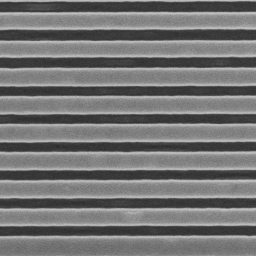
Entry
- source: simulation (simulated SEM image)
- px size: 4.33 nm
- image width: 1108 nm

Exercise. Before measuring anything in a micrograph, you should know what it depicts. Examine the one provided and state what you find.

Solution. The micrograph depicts parallel lines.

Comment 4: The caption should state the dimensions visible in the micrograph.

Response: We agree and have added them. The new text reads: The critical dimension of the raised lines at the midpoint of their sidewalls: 0.0769 micrometres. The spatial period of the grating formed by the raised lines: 122 nm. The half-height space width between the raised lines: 44.4 nm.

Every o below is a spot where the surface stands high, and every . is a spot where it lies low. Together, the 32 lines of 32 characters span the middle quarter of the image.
................................
oooooooooooooooooooooooooooooooo
oooooooooooooooooooooooooooooooo
oooooooooooooooooooooooooooooooo
oooooooooooooooooooooooooooooooo
..oooo.................oo.......
................................
................................
oooooooooooooooooooooooooooooooo
oooooooooooooooooooooooooooooooo
oooooooooooooooooooooooooooooooo
oooooooooooooooooooooooooooooooo
..o.oo.........o...oo...........
................................
................................
oooooooooooooooooooooooooooooooo
oooooooooooooooooooooooooooooooo
oooooooooooooooooooooooooooooooo
oooooooooooooooooooooooooooooooo
......o........................o
................................
................................
oooooooooooooooooooooooooooooooo
oooooooooooooooooooooooooooooooo
oooooooooooooooooooooooooooooooo
oooooooooooooooooooooooooooooooo
...oooo.....oooooo.....o.....o..
................................
................................
oooooooooooooooooooooooooooooooo
oooooooooooooooooooooooooooooooo
oooooooooooooooooooooooooooooooo